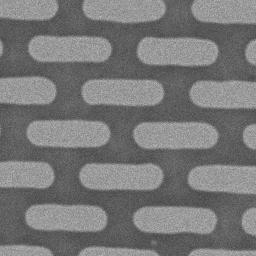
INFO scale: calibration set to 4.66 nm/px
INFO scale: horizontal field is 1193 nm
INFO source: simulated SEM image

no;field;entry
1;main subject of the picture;groups of lines, slits or small figures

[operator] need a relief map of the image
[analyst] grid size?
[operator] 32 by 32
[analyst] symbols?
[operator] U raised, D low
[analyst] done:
UUUUUUUDDDUUUUUUUUUUUDDDUUUUUUUU
UUUUUUUDDDDUUUUUUUUUUDDDUUUUUUUU
DDDDDDDDDDDDDDUUUUUDDDDDDUUUUUUU
DDDDDDDDDDDDDDDDDDDDDDDDDDDDDDDD
DDDDDDDDDDDDDDDDDDDDDDDDDDDDDDDD
DDDDUUUUUUUUUUDDDUUUUUUUUUUDDDDU
DDDDUUUUUUUUUUDDDUUUUUUUUUUDDDDU
DDDDDUUUUUUUUDDDDDUUUUUUUUUDDDDU
DDDDDDDDDDDDDDDDDDDDDDDDDDDDDDDD
DDDDDDDDDDDDDDDDDDDDDDDDDDDDDDDD
UUUUUUUDDDDUUUUUUUUUDDDDUUUUUUUU
UUUUUUUDDDUUUUUUUUUUDDDDUUUUUUUU
UUUUUUUDDDDUUUUUUUUUDDDDUUUUUUUU
DDDDDDDDDDDDDDDDDDDDDDDDDDDDDDDD
DDDDDDDDDDDDDDDDDDDDDDDDDDDDDDDD
DDDDUUUUUUUUUDDDDDUUUUUUUUDDDDDD
DDDDUUUUUUUUUUDDDUUUUUUUUUUDDDDU
DDDDUUUUUUUUUDDDDUUUUUUUUUUDDDUU
DDDDDDDDDDDDDDDDDDUUDUUDDDDDDDDU
DDDDDDDDDDDDDDDDDDDDDDDDDDDDDDDD
UUUUUUDDDDDDDDDDDDDDDDDDDDDDDDDD
UUUUUUUDDDUUUUUUUUUUDDDDUUUUUUUU
UUUUUUUDDDUUUUUUUUUUDDDDUUUUUUUU
DDDDDDDDDDDUUUUUUUUDDDDDUUUUUUUU
DDDDDDDDDDDDDDDDDDDDDDDDDDDDDDDD
DDDDDDDDDDDDDDDDDDDDDDDDDDDDDDDD
DDDUUUUUUUUUUDDDDUUUUUUUUUUDDDDU
DDDUUUUUUUUUUDDDDUUUUUUUUUUDDDUU
DDDDUUUUUUUUUDDDDUUUUUUUUUUDDDUU
DDDDDDDDDDDDDDDDDDDDDDDDDDDDDDDD
DDDDDDDDDDDDDDDDDDDDDDDDDDDDDDDD
UUUUUUDDDDUUUUUUUUUDDDDDUUUUUUUU